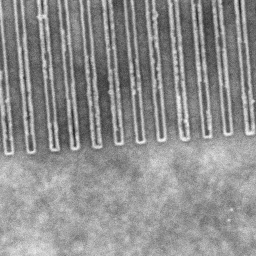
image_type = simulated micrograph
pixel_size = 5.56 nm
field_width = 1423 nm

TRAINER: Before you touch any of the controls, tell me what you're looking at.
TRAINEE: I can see parallel lines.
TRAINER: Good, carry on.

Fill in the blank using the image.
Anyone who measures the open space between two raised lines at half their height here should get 78.9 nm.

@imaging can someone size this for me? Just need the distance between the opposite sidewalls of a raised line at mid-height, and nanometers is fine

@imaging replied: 42.2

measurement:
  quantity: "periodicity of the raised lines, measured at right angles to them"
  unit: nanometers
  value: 122